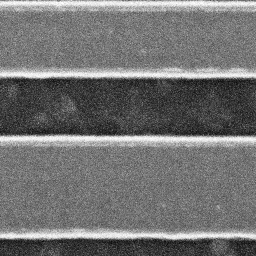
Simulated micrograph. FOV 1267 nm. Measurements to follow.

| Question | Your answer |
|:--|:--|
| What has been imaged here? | one or a few lines or trenches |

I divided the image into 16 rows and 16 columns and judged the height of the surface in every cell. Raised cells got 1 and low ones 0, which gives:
1111111111111111
1111111111111111
1111111111111111
1111111111111111
1111111111111111
0000000000000000
0000000000000000
0000000000000000
0000000000000000
1111111111111111
1111111111111111
1111111111111111
1111111111111111
1111111111111111
1111111111111111
0000000000000000